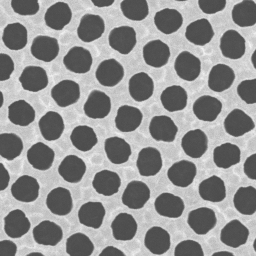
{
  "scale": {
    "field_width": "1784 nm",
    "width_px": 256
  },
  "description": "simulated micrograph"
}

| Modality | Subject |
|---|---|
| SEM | a regular array of holes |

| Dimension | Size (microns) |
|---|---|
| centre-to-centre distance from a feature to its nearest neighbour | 0.233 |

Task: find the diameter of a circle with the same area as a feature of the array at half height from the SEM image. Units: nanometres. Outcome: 187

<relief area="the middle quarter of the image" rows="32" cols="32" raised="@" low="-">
-------@@-----@@@@@@@@---@@@----
@@----@@-------@@@@@@@@@@@@@----
@@@@@@@@-------@@@---@@@@@@@----
@@@@@@@@------@@@-----@@@@@@@---
---@@@@@@-----@@------@@@@@@@@@@
----@@@@@@--@@@@------@@@@@--@@@
----@@@@@@@@@@@@------@@@-----@@
----@@@---@@@@@@@-----@@-------@
----@@-----@@@@@@----@@@-------@
---@@@------@@@@@@@@@@@@-------@
-@@@@-------@@@-@@@@@@@@@-----@@
@@@@@-------@------@@@@@@@---@@@
@@@@@@-----@@------@@@@@@@@@@@@@
@@@@@@@---@@@-------@@-----@@@@@
@@@@@@@@@@@@@------@@@-----@@@@@
@@@---@@@@@@@------@@-------@@@@
@@-----@@@@@@@----@@@-------@@@@
@@------@@@@@@@@@@@@@@------@@--
@-------@@@---@@@@@@@@------@@--
@@------@@------@@@@@@@@@@@@@---
@@@----@@@-------@@@@@@@@@@@@---
@@@@--@@@@-------@@----@@@@@@@--
@@@@@@@@@@@------@@-----@@@@@@@-
----@@@@@@@-----@@------@@@@@@@@
-----@@@@@@@---@@@-------@@@@---
------@@@@@@@@@@@@------@@@-----
-----@@@@@-@@@@@@@@-----@@------
-----@@@-----@@@@@@----@@@------
----@@@-------@@@@@@@@@@@@------
@--@@@@-------@@@--@@@@@@@@-----
@@@@@@@-------@@-----@@@@@@@---@
-@@@@@@@------@------@@@@@@@@@@@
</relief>